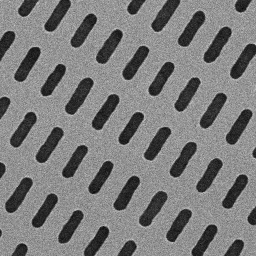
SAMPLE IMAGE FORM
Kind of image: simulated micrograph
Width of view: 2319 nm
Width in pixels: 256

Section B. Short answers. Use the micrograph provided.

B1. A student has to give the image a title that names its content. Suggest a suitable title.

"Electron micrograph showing a regular array of holes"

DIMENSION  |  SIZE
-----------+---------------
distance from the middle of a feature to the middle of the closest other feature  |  275 nm